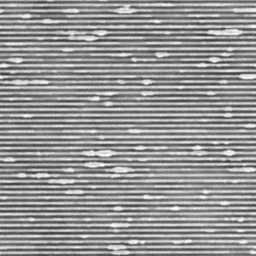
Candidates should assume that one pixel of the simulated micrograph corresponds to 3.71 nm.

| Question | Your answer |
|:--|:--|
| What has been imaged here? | parallel lines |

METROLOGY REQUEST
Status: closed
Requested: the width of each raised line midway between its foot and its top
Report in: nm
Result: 6.5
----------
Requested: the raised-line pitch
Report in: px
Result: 5.5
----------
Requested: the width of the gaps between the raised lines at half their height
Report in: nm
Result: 13